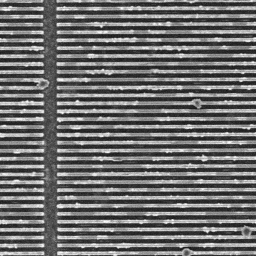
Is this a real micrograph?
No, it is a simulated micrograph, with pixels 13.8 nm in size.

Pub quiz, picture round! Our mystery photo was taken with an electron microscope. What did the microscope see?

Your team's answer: parallel lines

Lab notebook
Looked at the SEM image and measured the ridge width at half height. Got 48.4 nanometers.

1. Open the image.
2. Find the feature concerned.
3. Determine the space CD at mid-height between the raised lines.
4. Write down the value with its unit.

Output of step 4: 62.2 nanometers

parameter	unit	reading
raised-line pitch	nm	109